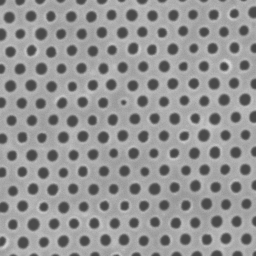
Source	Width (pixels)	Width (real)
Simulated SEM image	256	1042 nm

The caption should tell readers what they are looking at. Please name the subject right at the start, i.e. a regular array of holes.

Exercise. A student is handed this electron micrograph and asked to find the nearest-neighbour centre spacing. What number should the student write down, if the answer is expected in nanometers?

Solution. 78.3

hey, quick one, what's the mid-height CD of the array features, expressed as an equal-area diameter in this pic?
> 0.0408 microns